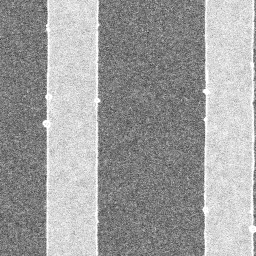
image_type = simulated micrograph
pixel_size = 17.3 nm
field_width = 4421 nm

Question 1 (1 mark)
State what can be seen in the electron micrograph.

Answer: one or a few lines or trenches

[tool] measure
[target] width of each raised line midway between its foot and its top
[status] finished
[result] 0.846 um